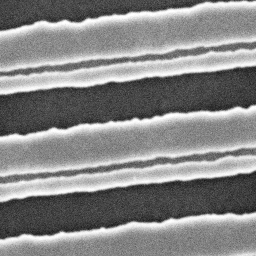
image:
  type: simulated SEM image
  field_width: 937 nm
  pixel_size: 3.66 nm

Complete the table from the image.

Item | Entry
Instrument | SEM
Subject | lines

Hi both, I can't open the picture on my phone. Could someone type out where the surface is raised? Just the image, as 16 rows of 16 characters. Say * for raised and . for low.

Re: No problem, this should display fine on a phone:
............****
..**************
****************
****************
************....
***.............
................
.........*******
.***************
****************
****************
********........
................
............****
.....***********
****************